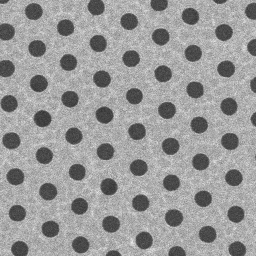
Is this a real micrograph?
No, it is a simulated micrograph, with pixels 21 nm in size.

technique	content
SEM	a regular array of holes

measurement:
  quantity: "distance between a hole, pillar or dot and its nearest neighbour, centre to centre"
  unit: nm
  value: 738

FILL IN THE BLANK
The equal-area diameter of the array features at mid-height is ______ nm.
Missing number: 373